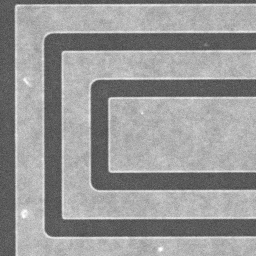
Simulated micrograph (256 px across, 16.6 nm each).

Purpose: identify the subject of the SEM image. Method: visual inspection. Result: groups of lines, slits or small figures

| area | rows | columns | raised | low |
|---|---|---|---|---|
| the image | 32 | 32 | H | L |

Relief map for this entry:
LLLLLLLLLLLLLLLLLLLLLLLLLLLLLLLL
LLHHHHHHHHHHHHHHHHHHHHHHHHHHHHHH
LLHHHHHHHHHHHHHHHHHHHHHHHHHHHHHH
LLHHHHHHHHHHHHHHHHHHHHHHHHHHHHHH
LLHHHHLLLLLLLLLLLLLLLLLLLLLLLLLL
LLHHHLLLLLLLLLLLLLLLLLLLLLLLLLLL
LLHHHLLLHHHHHHHHHHHHHHHHHHHHHHHH
LLHHHLLLHHHHHHHHHHHHHHHHHHHHHHHH
LLHHHLLLHHHHHHHHHHHHHHHHHHHHHHHH
LLHHHLLLHHHHHHHHHHHHHHHHHHHHHHHH
LLHHHLLLHHHLLLLLLLLLLLLLLLLLLLLL
LLHHHLLLHHHLLLLLLLLLLLLLLLLLLLLL
LLHHHLLLHHHLLLHHHHHHHHHHHHHHHHHH
LLHHHLLLHHHLLLHHHHHHHHHHHHHHHHHH
LLHHHLLLHHHLLLHHHHHHHHHHHHHHHHHH
LLHHHLLLHHHLLLHHHHHHHHHHHHHHHHHH
LLHHHLLLHHHLLLHHHHHHHHHHHHHHHHHH
LLHHHLLLHHHLLLHHHHHHHHHHHHHHHHHH
LLHHHLLLHHHLLLHHHHHHHHHHHHHHHHHH
LLHHHLLLHHHLLLHHHHHHHHHHHHHHHHHH
LLHHHLLLHHHLLLHHHHHHHHHHHHHHHHHH
LLHHHLLLHHHLLLLLLLLLLLLLLLLLLLLL
LLHHHLLLHHHLLLLLLLLLLLLLLLLLLLLL
LLHHHLLLHHHHLLLLLLLLLLLLLLLLLLLL
LLHHHLLLHHHHHHHHHHHHHHHHHHHHHHHH
LLHHHLLLHHHHHHHHHHHHHHHHHHHHHHHH
LLHHHLLLHHHHHHHHHHHHHHHHHHHHHHHH
LLHHHLLLLLLLLLLLLLLLLLLLLLLLLLLL
LLHHHLLLLLLLLLLLLLLLLLLLLLLLLLLL
LLHHHHLLLLLLLLLLLLLLLLLLLLLLLLLL
LLHHHHHHHHHHHHHHHHHHHHHHHHHHHHHH
LLHHHHHHHHHHHHHHHHHHHHHHHHHHHHHH